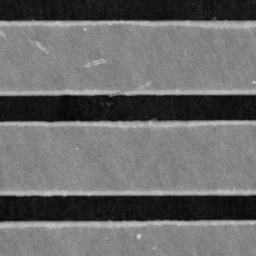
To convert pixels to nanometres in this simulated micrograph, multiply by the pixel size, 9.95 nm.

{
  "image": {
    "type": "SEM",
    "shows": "lines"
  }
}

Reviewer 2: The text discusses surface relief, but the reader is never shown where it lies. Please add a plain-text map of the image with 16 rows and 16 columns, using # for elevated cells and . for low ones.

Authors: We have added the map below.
................
################
################
################
################
################
................
................
################
################
################
################
................
................
################
################